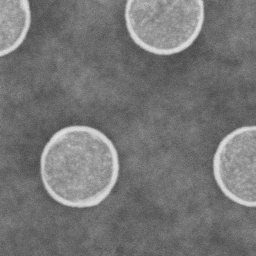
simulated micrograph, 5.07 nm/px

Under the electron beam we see raised bodies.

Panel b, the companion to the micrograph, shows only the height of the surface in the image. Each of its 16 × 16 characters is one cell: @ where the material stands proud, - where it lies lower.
@@------@@@@@---
@@------@@@@@---
@--------@@@----
----------------
----------------
----------------
----------------
----------------
----@@--------@@
---@@@@-------@@
---@@@@-------@@
---@@@@-------@@
----@@---------@
----------------
----------------
----------------